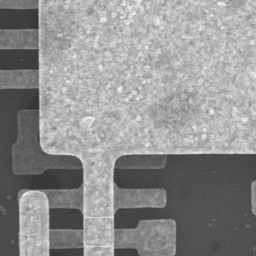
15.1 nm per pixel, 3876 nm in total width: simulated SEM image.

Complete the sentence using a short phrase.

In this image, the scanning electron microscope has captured wiring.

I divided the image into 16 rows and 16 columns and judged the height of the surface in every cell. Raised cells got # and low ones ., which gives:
..##############
..##############
..##############
..##############
..##############
..##############
..##############
..##############
..##############
...#############
.....##.........
.....##.........
.##..##.........
.##..##.........
.##..##.........
.##..##.........